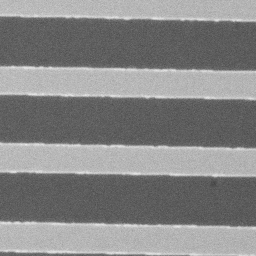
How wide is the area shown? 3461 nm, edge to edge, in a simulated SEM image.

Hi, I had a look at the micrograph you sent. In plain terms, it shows lines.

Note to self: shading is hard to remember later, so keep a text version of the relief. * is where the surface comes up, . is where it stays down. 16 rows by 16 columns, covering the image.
****************
................
................
................
****************
****************
................
................
................
****************
****************
................
................
................
****************
****************